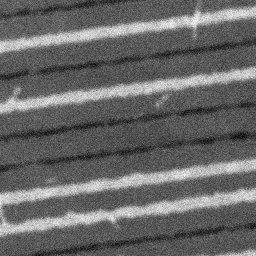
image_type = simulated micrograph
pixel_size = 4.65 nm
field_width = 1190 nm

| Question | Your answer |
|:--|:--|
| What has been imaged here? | parallel lines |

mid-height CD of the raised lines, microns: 0.0374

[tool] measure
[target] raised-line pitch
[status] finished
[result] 0.141 microns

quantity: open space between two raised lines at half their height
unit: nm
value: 102